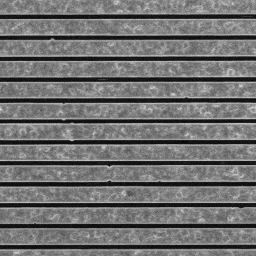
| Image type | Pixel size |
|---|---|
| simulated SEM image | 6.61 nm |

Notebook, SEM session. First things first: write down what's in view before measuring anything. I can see parallel lines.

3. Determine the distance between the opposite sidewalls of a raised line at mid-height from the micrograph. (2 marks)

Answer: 106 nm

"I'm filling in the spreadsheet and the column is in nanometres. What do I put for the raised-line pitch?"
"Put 138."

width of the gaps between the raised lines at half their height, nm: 35.5